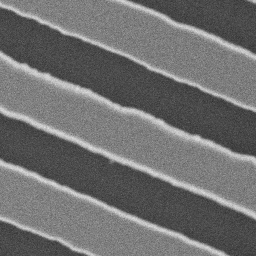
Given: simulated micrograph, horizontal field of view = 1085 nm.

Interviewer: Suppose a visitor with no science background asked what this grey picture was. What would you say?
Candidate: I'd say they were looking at lines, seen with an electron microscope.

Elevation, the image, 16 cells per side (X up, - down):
XXXXXXXXX-------
---XXXXXXXX-----
-----XXXXXXXXX--
--------XXXXXXXX
XXX-------XXXXXX
XXXXX-------XXXX
XXXXXXX--------X
-XXXXXXXXX------
----XXXXXXXX----
------XXXXXXXXX-
X-------XXXXXXXX
XXXX-------XXXXX
XXXXXX-------XXX
XXXXXXXX--------
--XXXXXXXXX-----
----XXXXXXXXX---